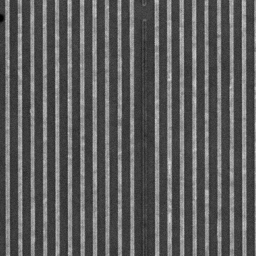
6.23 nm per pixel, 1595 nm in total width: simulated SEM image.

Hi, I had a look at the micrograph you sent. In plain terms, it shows parallel lines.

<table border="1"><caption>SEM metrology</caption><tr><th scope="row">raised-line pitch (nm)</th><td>77.6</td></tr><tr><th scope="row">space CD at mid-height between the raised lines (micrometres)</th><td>0.0584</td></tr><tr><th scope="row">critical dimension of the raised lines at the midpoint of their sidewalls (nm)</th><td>19.5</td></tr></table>